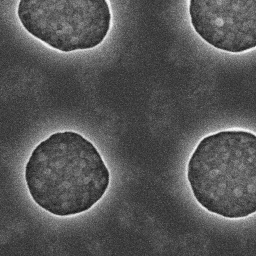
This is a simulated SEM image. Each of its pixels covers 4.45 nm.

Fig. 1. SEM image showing holes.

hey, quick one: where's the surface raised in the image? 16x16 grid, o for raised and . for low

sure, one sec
o......ooooo....
o......ooooo....
ooo...ooooooo...
oooooooooooooooo
oooooooooooooooo
oooooooooooooooo
oooooooooooooooo
oooooooooooooooo
ooo..oooooooo...
oo....oooooo....
oo.....ooooo....
oo.....ooooo....
oo....oooooo....
oooooooooooooo.o
oooooooooooooooo
oooooooooooooooo